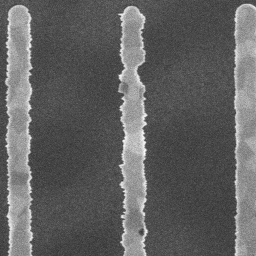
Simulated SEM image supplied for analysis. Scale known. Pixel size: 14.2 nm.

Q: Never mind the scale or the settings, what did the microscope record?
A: one or a few lines or trenches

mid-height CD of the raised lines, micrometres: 0.298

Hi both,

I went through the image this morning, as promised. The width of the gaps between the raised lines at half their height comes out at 1310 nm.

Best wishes